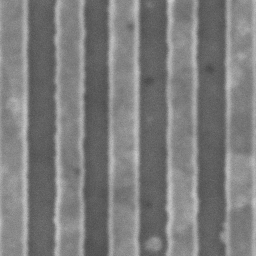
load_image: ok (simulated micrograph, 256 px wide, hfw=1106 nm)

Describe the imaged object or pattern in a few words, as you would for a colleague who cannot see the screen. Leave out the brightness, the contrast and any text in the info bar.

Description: lines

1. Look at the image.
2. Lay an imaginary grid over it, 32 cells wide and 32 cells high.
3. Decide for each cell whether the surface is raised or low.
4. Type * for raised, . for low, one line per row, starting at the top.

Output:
***....***....***....****...****
***....***....***....****...****
***....***....***....****...****
***....***....***....****...****
***....****...***....***....****
***....***....***....***.....***
***....***....***....***....****
***....***....***....***....****
***....***....***....***....****
***....***....***....***.....***
***....***....***....****...****
***....***....***....***....****
***....***....***....***....****
***....***....***....***....****
***....***....***....***....****
***....***....***....***....****
***....***....***....***....****
***....***....***....***....****
***....***....***....***....****
***....***....***....***....****
***....***....***....****...****
***....***....***....****...****
***....***....***....****...****
***....***....***....***....****
***....***....***....****...****
***....***....***....****...****
***....***....***....****...****
***....***....***....***....****
***....***....***....****...****
***....***....***....****...****
***....***....***....****...****
***....***....***....****...****